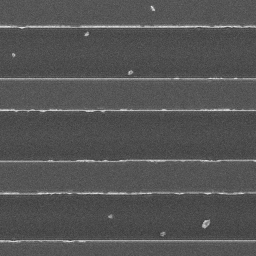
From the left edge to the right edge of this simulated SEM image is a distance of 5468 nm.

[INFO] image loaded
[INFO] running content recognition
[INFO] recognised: lines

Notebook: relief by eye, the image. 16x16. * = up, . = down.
****************
****************
................
................
................
****************
****************
................
................
................
****************
****************
................
................
................
****************